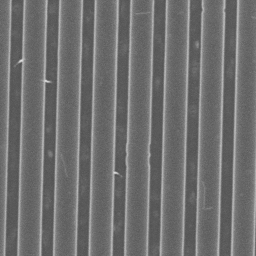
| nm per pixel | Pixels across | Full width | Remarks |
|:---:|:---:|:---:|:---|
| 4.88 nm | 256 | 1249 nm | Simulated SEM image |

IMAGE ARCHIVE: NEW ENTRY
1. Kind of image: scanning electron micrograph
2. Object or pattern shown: parallel lines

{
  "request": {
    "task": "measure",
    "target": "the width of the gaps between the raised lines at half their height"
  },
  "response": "62.2 nm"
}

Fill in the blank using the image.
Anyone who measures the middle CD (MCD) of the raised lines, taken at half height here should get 0.112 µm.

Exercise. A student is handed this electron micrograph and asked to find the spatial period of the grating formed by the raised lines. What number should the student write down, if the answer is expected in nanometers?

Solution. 174